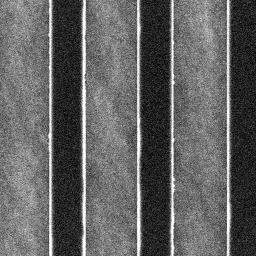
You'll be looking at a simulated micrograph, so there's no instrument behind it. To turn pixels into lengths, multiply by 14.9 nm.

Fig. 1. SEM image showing lines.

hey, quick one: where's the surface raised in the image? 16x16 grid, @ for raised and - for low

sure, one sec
---@@----@@---@@
---@@----@@---@@
---@@----@@---@@
---@@----@@---@@
---@@----@@---@@
---@@----@@---@@
---@@----@@---@@
---@@----@@---@@
---@@----@@---@@
---@@----@@---@@
---@@----@@---@@
---@@----@@---@@
---@@----@@---@@
---@@----@@---@@
---@@----@@---@@
---@@----@@---@@